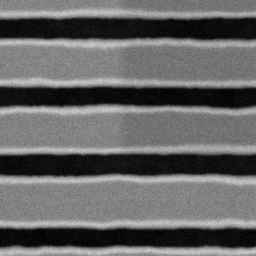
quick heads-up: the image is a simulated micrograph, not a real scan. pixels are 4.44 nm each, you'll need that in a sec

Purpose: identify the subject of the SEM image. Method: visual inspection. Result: lines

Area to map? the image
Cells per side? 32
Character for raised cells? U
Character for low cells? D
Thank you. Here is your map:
UUUUUUUUUUUUUUUUUUUUUUUUUUUUUUUU
UUUUUUUUUUUUUUUUUUUUUUUUUUUUUUUU
DDDDDDDDDDDDDDDDDDDDDDDDDDDDDDDD
DDDDDDDDDDDDDDDDDDDDDDDDDDDDDDDD
DDDDDDDDDDDDDDDDDDDDDDDDDDDDDDDD
UUUUUUUUUUUUUUUUUUUUUUUUUUUUUUUU
UUUUUUUUUUUUUUUUUUUUUUUUUUUUUUUU
UUUUUUUUUUUUUUUUUUUUUUUUUUUUUUUU
UUUUUUUUUUUUUUUUUUUUUUUUUUUUUUUU
UUUUUUUUUUUUUUUUUUUUUUUUUUUUUUUU
UUUUUUUUUUUUUUUUUUUUUUUUUUUUUUUU
DDDDDDDDDDDDDDDDDDDDDDDDDDDDDDDD
DDDDDDDDDDDDDDDDDDDDDDDDDDDDDDDD
UUUUUUUUUUUUUUUUUUUUUUUUUUUDDDDU
UUUUUUUUUUUUUUUUUUUUUUUUUUUUUUUU
UUUUUUUUUUUUUUUUUUUUUUUUUUUUUUUU
UUUUUUUUUUUUUUUUUUUUUUUUUUUUUUUU
UUUUUUUUUUUUUUUUUUUUUUUUUUUUUUUU
UUUUUUUUUUUUUUUUUUUUUUUUUUUUUUUU
DDDDDDDDDDDDDDDDDDDDDDDDDDDDDDDD
DDDDDDDDDDDDDDDDDDDDDDDDDDDDDDDD
DDDDDDDDDDDDDDDDDDDDDDDDDDDDDDDD
UUUUUUUUUUUUUUUUUUUUUUUUUUUUUUUU
UUUUUUUUUUUUUUUUUUUUUUUUUUUUUUUU
UUUUUUUUUUUUUUUUUUUUUUUUUUUUUUUU
UUUUUUUUUUUUUUUUUUUUUUUUUUUUUUUU
UUUUUUUUUUUUUUUUUUUUUUUUUUUUUUUU
UUUUUUUUUUUUUUUUUUUUUUUUUUUUUUUU
DDDDDDDDDDDDUUDDDDDDDDDDDDDDDDDD
DDDDDDDDDDDDDDDDDDDDDDDDDDDDDDDD
DDDDDDDDDDDDDDDDDDDDDDDDDDDDDDDD
UUUUUUUUUUUUUUUUUUUUUUUUUUUUUUUU